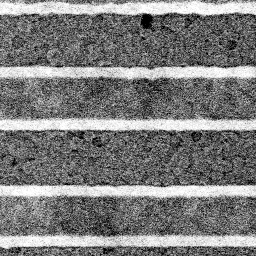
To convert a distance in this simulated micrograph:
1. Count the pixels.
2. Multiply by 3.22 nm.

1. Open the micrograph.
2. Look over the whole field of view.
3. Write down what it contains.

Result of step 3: one or a few lines or trenches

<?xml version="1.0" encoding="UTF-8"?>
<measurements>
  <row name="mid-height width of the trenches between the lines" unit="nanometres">205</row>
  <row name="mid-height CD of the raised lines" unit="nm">169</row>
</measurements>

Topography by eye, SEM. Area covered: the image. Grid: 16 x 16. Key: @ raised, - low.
@@@@@@@@@@@@@@@@
----------------
----------------
----------------
@@@@@@@---@@--@@
@@@@@@@@@@@@@@@@
@@@@@@@@@@@@@@@@
@@@@@@@@@@@@@@@@
----------------
----------------
----------------
----------------
@@@@@@@@@@@@@@@@
@@@@@@@@@@@@@@@@
@@@@@@@@@@@@@@@@
----------------